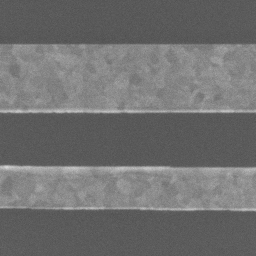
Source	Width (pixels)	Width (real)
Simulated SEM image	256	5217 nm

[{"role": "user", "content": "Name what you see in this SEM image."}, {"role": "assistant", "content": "lines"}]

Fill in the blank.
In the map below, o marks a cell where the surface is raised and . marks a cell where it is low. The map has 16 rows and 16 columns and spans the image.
................
................
................
oooooooooooooooo
oooooooooooooooo
oooooooooooooooo
oooooooooooooooo
................
................
................
................
oooooooooooooooo
oooooooooooooooo
................
................
................